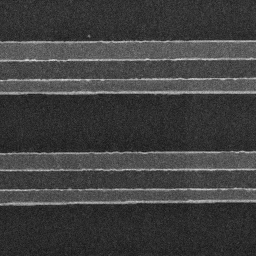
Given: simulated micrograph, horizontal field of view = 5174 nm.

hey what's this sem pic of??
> lines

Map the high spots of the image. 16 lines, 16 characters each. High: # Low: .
................
................
................
################
################
################
................
................
................
................
################
################
################
................
................
................